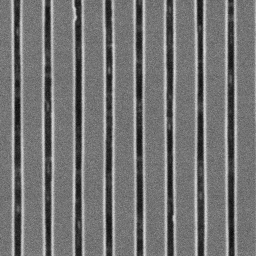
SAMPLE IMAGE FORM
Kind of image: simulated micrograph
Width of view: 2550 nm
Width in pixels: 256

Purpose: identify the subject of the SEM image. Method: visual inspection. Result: parallel lines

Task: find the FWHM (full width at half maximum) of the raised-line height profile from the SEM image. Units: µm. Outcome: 0.229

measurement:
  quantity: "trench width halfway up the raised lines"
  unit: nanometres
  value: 70.9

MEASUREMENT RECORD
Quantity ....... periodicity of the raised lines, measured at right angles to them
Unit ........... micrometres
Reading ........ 0.303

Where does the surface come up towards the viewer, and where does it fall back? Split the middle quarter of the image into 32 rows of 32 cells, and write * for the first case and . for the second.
***..*****..******..*****...****
***..*****..******..*****...****
***..*****..******..*****...****
***..*****..******..*****...****
***..*****..******..*****..*****
***..*****..******..*****..*****
***..*****..******..*****..*****
***..*****..******..*****..*****
***..*****..******..*****..*****
***..*****..******..*****..*****
**...*****..******..*****..*****
**...*****..******..*****..*****
***..*****..******..*****..*****
***..*****..******..*****..*****
***..*****..******..*****..*****
***..*****..******..*****..*****
***..*****..******..*****..*****
***..*****..******..*****..*****
***..*****..******..*****..*****
***..*****..******..*****..*****
***..*****..******..*****..*****
***..*****..******..*****..*****
***..*****..******..*****..*****
***..*****..******..*****...****
***..*****..******..*****...****
***..*****..******..*****...****
***..*****..******..*****...****
***..*****..******..******..****
***..*****..******..******..****
***..*****..******..******..****
***..*****..******..******..****
***..*****..******..******..****